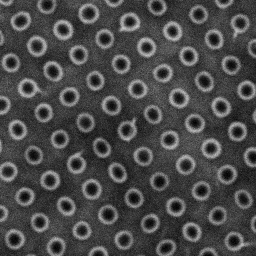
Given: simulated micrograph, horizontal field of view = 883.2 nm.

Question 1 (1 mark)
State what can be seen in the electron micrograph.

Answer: a regular array of raised bodies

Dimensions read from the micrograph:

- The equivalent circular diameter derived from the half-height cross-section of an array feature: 60 nanometers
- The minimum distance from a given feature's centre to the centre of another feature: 0.103 microns